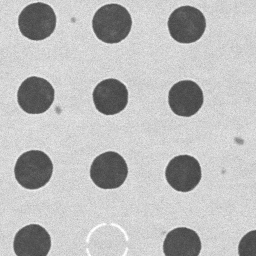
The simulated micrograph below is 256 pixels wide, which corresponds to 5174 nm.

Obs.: a regular array of holes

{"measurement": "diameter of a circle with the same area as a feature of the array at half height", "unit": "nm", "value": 771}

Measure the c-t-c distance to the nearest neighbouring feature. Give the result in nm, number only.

1490